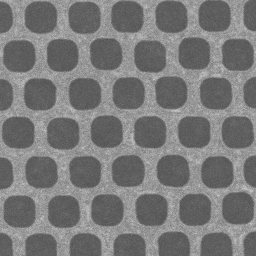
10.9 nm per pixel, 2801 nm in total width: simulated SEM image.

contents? a regular array of holes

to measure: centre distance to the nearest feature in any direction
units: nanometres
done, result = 475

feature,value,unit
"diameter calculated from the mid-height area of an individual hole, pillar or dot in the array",378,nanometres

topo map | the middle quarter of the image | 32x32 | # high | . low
...####.......####.......####...
..#######...#######......######.
################################
###....#######....######.....###
##.......####.......###.......##
#........###........###........#
#........###........###........#
#........###........###........#
#........###........###........#
#........###........###........#
##......#####......#####......##
###....#######..################
################################
..######......#####.....######..
...####.......####.......####...
....###........##.........##....
....###........##.........##....
....###........##.........##....
....###........##.........###...
....###.......####.......####...
...#####.....######......#####..
################################
##########################..####
##......#####......#####......##
#........###........###........#
#........###........###........#
#........###........###........#
#........###........###.........
#........###........###........#
##.......###........####.......#
###.....######....########....##
################################